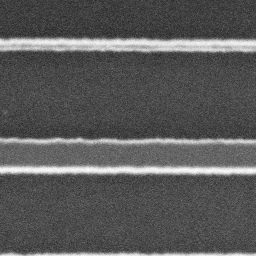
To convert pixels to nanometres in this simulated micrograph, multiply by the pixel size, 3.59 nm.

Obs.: lines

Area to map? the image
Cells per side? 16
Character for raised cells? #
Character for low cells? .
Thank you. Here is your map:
................
................
................
................
................
................
................
................
................
################
################
................
................
................
................
................